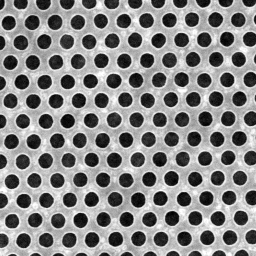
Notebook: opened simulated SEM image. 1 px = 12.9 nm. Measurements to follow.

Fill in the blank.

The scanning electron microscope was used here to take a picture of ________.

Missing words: a regular array of holes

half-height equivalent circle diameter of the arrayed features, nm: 194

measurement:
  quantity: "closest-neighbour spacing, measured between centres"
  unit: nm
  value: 289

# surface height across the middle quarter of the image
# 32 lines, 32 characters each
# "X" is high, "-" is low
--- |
XX---XXX---XXX--XXX---XXX---XXX-
XXXXXXXXXXXXXXXXXXXXXXXXXXXXXXXX
XXXXXX-XXXXX-XXXX--XXXX--XXX---X
--XXX---XXX---XX----XX----XX---X
---XX---XX----XX----XX---XXX---X
---XX---XXX---XXX--XXX---XXX--XX
XXXXXXXXXXXXXXXXXXXXXXXXXXXXXXXX
XXX-XXXX--XXXX--XXXX--XXX---XXX-
XX----XX---XXX---XX----XX---XX--
XX----XX---XXX---XX----XX---XXX-
XX---XXX---XXX---XXX--XXXX--XXX-
XXXXXXXXXXXXXXXXXXXXXXXXXXXXXXXX
XXXXXX--XXX---XXX--XXXX--XXX---X
---XX----XX---XX----XX----XX---X
---XX----XX---XX----XX----XX---X
--XXXX--XXX---XXX--XXXX--XXXX--X
XXXXXXXXXXXXXXXXXXXXXXXXXXXXXXXX
XXX--XXXX--XXX---XXX---XXX--XXX-
XX----XX---XXX---XX----XX----XX-
XX----XX---XXX---XX----XX----XX-
XXX--XXX---XXX---XXX--XXXX--XXXX
XXXXXXXXXXXXXXXXXXXXXXXXXXXXXXXX
--XXXX--XXX---XXX---XXX--XXX---X
---XX----XX---XXX---XX----XX----
---XX----XX---XXX---XX----XX---X
--XXXX--XXX---XXX--XXXX--XXXX--X
XXXXXXXXXXXXXXXXXXXXXXXXXXXXXXXX
XXX--XXXX--XXXX-XXXX---XX---XXX-
XX----XX----XX---XXX---XX----XX-
XX----XX---XXX---XXX---XX----XX-
XXX--XXXX--XXX---XXXX-XXXX-XXXXX
XXXXXXXXXXXXXXXXXXXXXXXXXXXXXXXX